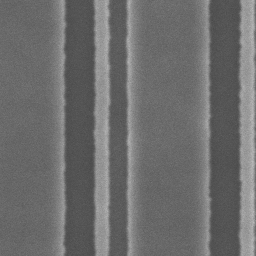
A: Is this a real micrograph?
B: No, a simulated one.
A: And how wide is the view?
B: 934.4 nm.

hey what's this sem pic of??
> lines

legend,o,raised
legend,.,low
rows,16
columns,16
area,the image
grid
oooo..ooooooo..o
oooo..ooooooo..o
oooo..ooooooo..o
oooo..ooooooo..o
oooo..ooooooo..o
oooo..ooooooo..o
oooo..ooooooo..o
oooo..ooooooo..o
oooo..ooooooo..o
oooo..ooooooo..o
oooo..ooooooo..o
oooo..ooooooo..o
oooo..ooooooo..o
oooo..ooooooo..o
oooo..ooooooo..o
oooo..ooooooo..o